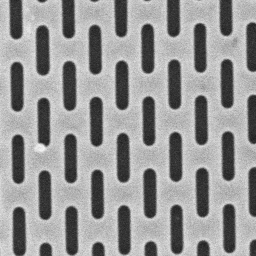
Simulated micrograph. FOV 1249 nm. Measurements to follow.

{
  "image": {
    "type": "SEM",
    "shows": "groups of lines, slits or small figures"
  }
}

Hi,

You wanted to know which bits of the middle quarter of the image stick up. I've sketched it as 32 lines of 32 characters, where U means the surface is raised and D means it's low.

DDDUUUDDDDUUUDDDUUUDDDDUUUDDDUUU
DDDUUUDDDUUUUDDDUUUUDDUUUUDDDUUU
DDDUUUUDUUUUUDDDUUUUUUUUUUDDDUUU
DDDUUUUUUUUUUDDDUUUUUUUUUUDDDUUU
DDDUUUUUUUUUUDDDUUUUUUUUUUDDDUUU
DDDUUUUUUUUUUDDDUUUUUUUUUUDDDUUU
DDDUUUUUUUUUUDDDUUUUUUUUUUDDDUUU
DDDUUUUUUUUUUDDDUUUUUUUUUUDDDUUU
DDDUUUUDDUUUUDDDUUUUDDUUUUDDDUUU
DDDUUUUDDDUUUDDDUUUDDDDUUUDDDUUU
DDDUUUDDDDUUUDDDUUUDDDDUUUDDDUUU
UDUUUUDDDDUUUUDUUUUDDDDUUUUUUUUU
UUUUUUDDDDUUUUUUUUUDDDDUUUUUUUUU
UUUUUUDDDDUUUUUUUUUDDDDUUUUUUUUU
UUUUUUDDDDUUUUUUUUUDDDDUUUUUUUUU
UUUUUUDDDDUUUUUUUUUDDDDUUUUUUUUU
UUUUUUUDDDUUUUUUUUUUDDDUUUUUUUUU
UDUUUUUDDDUUUUDDUUUUDDDUUUUDDUUU
DDDUUUUDDDUUUDDDUUUUDDDUUUDDDDUU
DDDUUUUDDDUUUDDDUUUUDDDUUUDDDDUU
DDDUUUUDDUUUUDDDUUUUUDUUUUDDDDUU
DDDUUUUUUUUUUDDDUUUUUUUUUUDDDDUU
DDDUUUUUUUUUUDDDUUUUUUUUUUDDDDUU
DDDUUUUUUUUUUDDDUUUUUUUUUUDDDDUU
DDDUUUUUUUUUUDDDDUUUUUUUUUDDDDUU
DDDUUUUUUUUUUDDDDUUUUUUUUUDDDDUU
DDDUUUUDDUUUUDDDDUUUDDDUUUDDDDUU
DDDDUUUDDDUUUDDDDUUUDDDUUUDDDDUU
DDDUUUUDDDUUUDDDUUUUDDDUUUUDDUUU
UDDUUUUDDDUUUUDUUUUUDDDUUUUUUUUU
UUUUUUUDDDUUUUUUUUUUDDDUUUUUUUUU
UUUUUUUDDDUUUUUUUUUUDDDUUUUUUUUU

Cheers